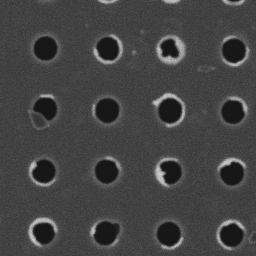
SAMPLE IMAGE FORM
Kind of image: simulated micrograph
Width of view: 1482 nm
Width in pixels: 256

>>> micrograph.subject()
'a regular array of holes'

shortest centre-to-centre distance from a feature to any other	0.353	microns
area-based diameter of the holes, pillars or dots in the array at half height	0.135	micrometres